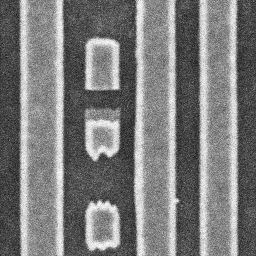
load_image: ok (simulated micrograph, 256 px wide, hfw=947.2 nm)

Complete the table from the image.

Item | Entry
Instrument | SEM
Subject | one or a few lines or trenches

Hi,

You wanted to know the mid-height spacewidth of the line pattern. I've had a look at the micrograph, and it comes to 29.1 pixels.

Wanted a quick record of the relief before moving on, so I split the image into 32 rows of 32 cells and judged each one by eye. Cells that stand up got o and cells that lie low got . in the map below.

...oooo..........ooooo...oooo...
...oooo..........ooooo...oooo...
...oooo..........ooooo...oooo...
...oooo..........ooooo...oooo...
...oooo..........ooooo...oooo...
...oooo....ooo...ooooo...oooo...
...oooo....oooo..ooooo...oooo...
...oooo....oooo..ooooo...oooo...
...oooo....oooo..ooooo...oooo...
...oooo....oooo..ooooo...oooo...
...oooo....oooo..ooooo...oooo...
...oooo..........ooooo...oooo...
...oooo..........ooooo...oooo...
...oooo..........ooooo...oooo...
...oooo..........ooooo...oooo...
...oooo....ooo...ooooo...oooo...
...oooo....oooo..ooooo...oooo...
...oooo....oooo..ooooo...oooo...
...oooo....oooo..ooooo...oooo...
...oooo..........ooooo...oooo...
...ooooo.........ooooo...oooo...
...ooooo.........ooooo...oooo...
...ooooo.........ooooo...oooo...
...ooooo.........ooooo...oooo...
...ooooo.........ooooo...oooo...
...ooooo.........ooooo...oooo...
...ooooo...oooo..ooooo...oooo...
...ooooo...oooo..ooooo...oooo...
...ooooo...oooo..ooooo...oooo...
...ooooo...oooo..ooooo...oooo...
...ooooo...ooo...ooooo...oooo...
...ooooo..........oooo...oooo...